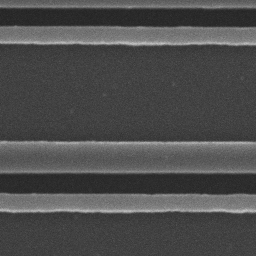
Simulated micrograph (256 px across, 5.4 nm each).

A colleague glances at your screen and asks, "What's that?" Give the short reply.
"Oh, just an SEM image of lines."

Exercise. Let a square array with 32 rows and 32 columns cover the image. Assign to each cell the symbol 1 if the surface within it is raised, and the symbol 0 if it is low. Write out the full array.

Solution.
11111111111111111111111111111111
00000000000000000000000000000000
00000000000000000000000000000000
11111111111111111111111111111111
11111111111111111111111111111111
00000000000000000000000000000000
00000000000000000000000000000000
00000000000000000000000000000000
00000000000000000000000000000000
00000000000000000000000000000000
00000000000000000000000000000000
00000000000000000000000000000000
00000000000000000000000000000000
00000000000000000000000000000000
00000000000000000000000000000000
00000000000000000000000000000000
00000000000000000000000000000000
00000000000000000000000000000000
11111111111111111111111111111111
11111111111111111111111111111111
11111111111111111111111111111111
11001000000001001100000001101100
00000000000000000000000000000000
00000000000000000000000000000000
11111111111111111111111111111111
11111111111111111111111111111111
00000000000000000000000000000000
00000000000000000000000000000000
00000000000000000000000000000000
00000000000000000000000000000000
00000000000000000000000000000000
00000000000000000000000000000000